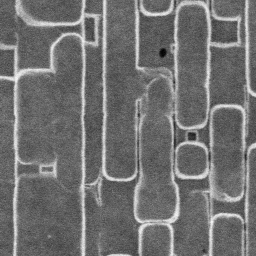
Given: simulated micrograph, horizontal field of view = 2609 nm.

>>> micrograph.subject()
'wiring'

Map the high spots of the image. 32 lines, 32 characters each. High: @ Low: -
--@@@@@@@@---@@@@@@@@@-@@------@
--@@@@@@@@---@@@@-@@@-@@@@-----@
---@@@@@@@---@@@@-----@@@@-----@
-------------@@@@-----@@@@-----@
--------@@---@@@@-----@@@@-----@
-------@@@---@@@@-----@@@@-----@
------@@@@---@@@@-----@@@@-----@
------@@@@@--@@@@-----@@@@-----@
------@@@@@--@@@@@----@@@@-----@
--@@@@@@@@---@@@@@@@@-@@@@-----@
--@@@@@@@@---@@@@@@@@@@@@@-----@
--@@@@@@@@---@@@@@@@@@@@@@-----@
--@@@@@@@@---@@@@@@@@@@@@@------
--@@@@@@@@---@@@@@@@@@@@@@-@@@--
--@@@@@@@@---@@@@@@@@@@@@@@@@@@-
--@@@@@@@@---@@@@@@@@@@@@@@@@@@-
--@@@@@@@@---@@@@@@@@@----@@@@--
--@@@@@@@@---@@@@@@@@@----@@@@--
--@@@@@@@@---@@@@@@@@@@@@@@@@@@@
--@@@@@@@@---@@@@@@@@@@@@@@@@@@@
--@@@@@@@@---@@@@@@@@@@@@@@@@@@@
--@@@-@@@@---@@@@@@@@@@@@@@@@@@@
--@@@@@@@@----@@-@@@@@----@@@@@@
--@@@@@@@@-------@@@@@----@@@@@@
--@@@@@@@@-------@@@@@-----@@@-@
--@@@@@@@@-------@@@@@---------@
--@@@@@@@@-------@@@@@---------@
--@@@@@@@@-------@@@@@-----@@@@@
--@@@@@@@@--------@@@-----@@@@@@
--@@@@@@@@-------@@@@-----@@@@@@
--@@@@@@@@-------@@@@-----@@@@@@
--@@@@@@@@-------@@@@-----@@@@@@